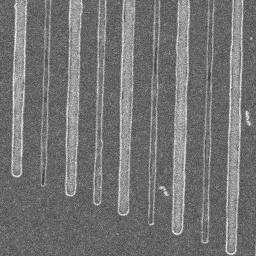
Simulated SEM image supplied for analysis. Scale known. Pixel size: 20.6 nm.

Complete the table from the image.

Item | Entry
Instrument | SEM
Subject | parallel lines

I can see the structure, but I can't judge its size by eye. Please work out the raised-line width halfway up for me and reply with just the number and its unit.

418 nanometres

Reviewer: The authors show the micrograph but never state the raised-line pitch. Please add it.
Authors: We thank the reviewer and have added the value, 551 nanometres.